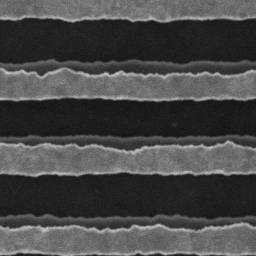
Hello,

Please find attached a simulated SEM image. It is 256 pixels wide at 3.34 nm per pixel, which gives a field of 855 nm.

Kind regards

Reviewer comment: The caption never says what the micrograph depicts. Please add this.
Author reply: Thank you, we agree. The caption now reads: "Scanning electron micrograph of lines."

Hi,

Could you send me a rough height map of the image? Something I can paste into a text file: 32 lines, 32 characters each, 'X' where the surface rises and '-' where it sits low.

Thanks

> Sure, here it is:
XXXXXXXXXXXXXXXXXXXXXXXXXXXXXXXX
XXXXXXXXXXXXXXXXXXXXXXXXXXXXXXXX
--------XX------XXXXXX----------
--------------------------------
--------------------------------
--------------------------------
--------------------------------
--------------------------------
XXXXXXXXXXXXXXXXXXXXXXXXXXXXXXXX
XXXXXXXXXXXXXXXXXXXXXXXXXXXXXXXX
XXXXXXXXXXXXXXXXXXXXXXXXXXXXXXXX
XXXXXXXXXXXXXXXXXXXXXXXXXXXXXXXX
-XX--------------XXXXX--X-----X-
--------------------------------
--------------------------------
--------------------------------
--------------------------------
XXXXXXXXXXXXXXXXXXXXXXXXXXXXXXXX
XXXXXXXXXXXXXXXXXXXXXXXXXXXXXXXX
XXXXXXXXXXXXXXXXXXXXXXXXXXXXXXXX
XXXXXXXXXXXXXXXXXXXXXXXXXXXXXXXX
XXXXXXXXXXXXXXXXXXXXXXXXXXXXXXXX
--------------------------------
--------------------------------
--------------------------------
--------------------------------
--------------------------------
XXXXXXXXXXXXXXXXXXXXXXXXXXXXXXXX
XXXXXXXXXXXXXXXXXXXXXXXXXXXXXXXX
XXXXXXXXXXXXXXXXXXXXXXXXXXXXXXXX
XXXXXXXXXXXXXXXXXXXXXXXXXXXXXXXX
XXXXXXXXXXXXXXXXXXXXXXXXXXXXXXXX